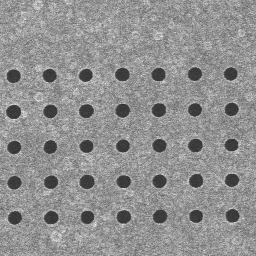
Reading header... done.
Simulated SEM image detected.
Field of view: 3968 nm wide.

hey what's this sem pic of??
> a regular array of holes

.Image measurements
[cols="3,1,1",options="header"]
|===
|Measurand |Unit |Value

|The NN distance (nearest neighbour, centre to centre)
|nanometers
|548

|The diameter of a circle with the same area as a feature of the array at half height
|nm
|221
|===